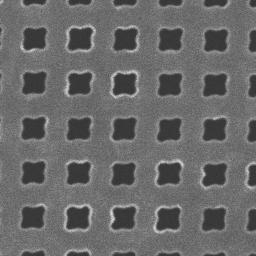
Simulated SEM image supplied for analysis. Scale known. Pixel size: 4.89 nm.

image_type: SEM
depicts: a regular array of holes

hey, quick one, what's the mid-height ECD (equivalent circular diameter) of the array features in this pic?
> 115 nanometers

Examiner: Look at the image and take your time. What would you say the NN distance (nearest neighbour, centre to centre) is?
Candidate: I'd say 218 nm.